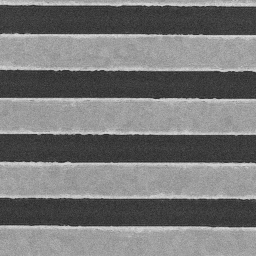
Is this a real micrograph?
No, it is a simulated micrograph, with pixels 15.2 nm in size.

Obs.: lines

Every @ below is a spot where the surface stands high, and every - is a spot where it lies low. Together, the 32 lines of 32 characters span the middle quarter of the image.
@@@@@@@@@@@@@@@@@@@@@@@@@@@@@@@@
-@@-@@@@@-@@@--@---@@@@@@@@@@@@@
--------------------------------
--------------------------------
--------------------------------
--------------------------------
--------------------------------
--------------------------------
--------------------------------
@@@@@@@@@@@@@@@@@@@@@@@@@@@@@@@@
@@@@@@@@@@@@@@@@@@@@@@@@@@@@@@@@
@@@@@@@@@@@@@@@@@@@@@@@@@@@@@@@@
@@@@@@@@@@@@@@@@@@@@@@@@@@@@@@@@
@@@@@@@@@@@@@@@@@@@@@@@@@@@@@@@@
@@@@@@@@@@@@@@@@@@@@@@@@@@@@@@@@
@@@@@@@@@@@@@@@@@@@@@@@@@@@@@@@@
@@@@@@@@@@@@@@@@@@@@@@@@@@@@@@@@
----@---@@-@-@@@-@-@@@@@@@@@@@@@
--------------------------------
--------------------------------
--------------------------------
--------------------------------
--------------------------------
--------------------------------
--------------------------------
@@@@@@@@@@@@@@@@@@@@@@@@@@@@@@@@
@@@@@@@@@@@@@@@@@@@@@@@@@@@@@@@@
@@@@@@@@@@@@@@@@@@@@@@@@@@@@@@@@
@@@@@@@@@@@@@@@@@@@@@@@@@@@@@@@@
@@@@@@@@@@@@@@@@@@@@@@@@@@@@@@@@
@@@@@@@@@@@@@@@@@@@@@@@@@@@@@@@@
@@@@@@@@@@@@@@@@@@@@@@@@@@@@@@@@